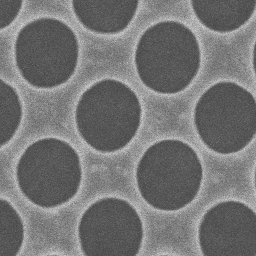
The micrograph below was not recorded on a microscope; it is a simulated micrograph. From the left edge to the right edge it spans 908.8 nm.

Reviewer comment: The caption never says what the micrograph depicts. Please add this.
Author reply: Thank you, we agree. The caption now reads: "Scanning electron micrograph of holes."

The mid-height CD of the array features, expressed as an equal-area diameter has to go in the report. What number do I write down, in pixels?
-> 68.3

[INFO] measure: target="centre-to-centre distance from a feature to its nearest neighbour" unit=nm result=296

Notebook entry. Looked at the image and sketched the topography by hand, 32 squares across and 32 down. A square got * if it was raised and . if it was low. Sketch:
...******........*******........
..*******........*******........
..***..***......*********......*
***......**.....***....***....**
**.......*********......********
**........*******........*******
**........*******........*******
**........*******........*******
**.......********........*******
***......********.......********
.***....****....**......***..***
..*********......***..****.....*
..********.......********.......
...*******........******........
...******.........******........
..********.......*******........
..********.......********.......
.****...***.....*****.***......*
***......***...****.....**....**
***.......********.......*******
**........*******........*******
**........*******........*******
**........*******........*******
***.......*******........*******
***......*********......********
.***....****....***....****...**
..*********......*********......
...*******........*******.......
...*******........*******.......
...*******........*******.......
...*******........*******.......
..********.......********.......